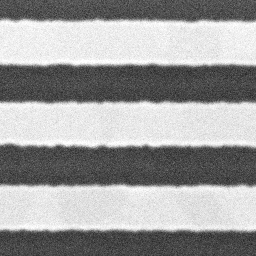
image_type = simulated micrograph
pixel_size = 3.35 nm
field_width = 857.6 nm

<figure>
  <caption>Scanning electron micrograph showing lines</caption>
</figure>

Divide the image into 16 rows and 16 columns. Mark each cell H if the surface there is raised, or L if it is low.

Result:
LLLLLLLLLLLLLLLL
HHHHHHHHHHHHHHHH
HHHHHHHHHHHHHHHH
HHHHHHHHHHHHHHHH
LLLLLLLLLLLLLLLL
LLLLLLLLLLLLLLLL
HHHHHHHHHHHHHHHH
HHHHHHHHHHHHHHHH
HHHHHHHHHHHHHHHH
LLLLLLLLLLLLLLLL
LLLLLLLLLLLLLLLL
LLLLLLLLLLLLLLLL
HHHHHHHHHHHHHHHH
HHHHHHHHHHHHHHHH
LLLLLLLLLLLLLLLL
LLLLLLLLLLLLLLLL